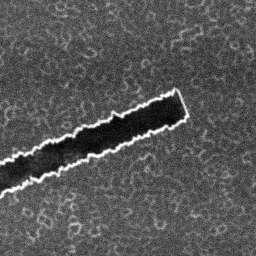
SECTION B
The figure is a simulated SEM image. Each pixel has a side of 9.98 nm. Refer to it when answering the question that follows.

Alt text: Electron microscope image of one or a few lines or trenches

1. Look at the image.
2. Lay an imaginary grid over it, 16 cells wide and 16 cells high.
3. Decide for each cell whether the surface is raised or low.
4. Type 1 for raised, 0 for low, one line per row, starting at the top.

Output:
1111111111111111
1111111111111111
1111111111111111
1111111111111111
1111111111111111
1111111111111111
1111111110011111
1111111000011111
1111000001111111
1100000111111111
0000111111111111
0011111111111111
1111111111111111
1111111111111111
1111111111111111
1111111111111111